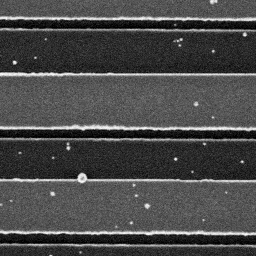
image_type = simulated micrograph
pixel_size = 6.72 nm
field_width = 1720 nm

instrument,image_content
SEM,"lines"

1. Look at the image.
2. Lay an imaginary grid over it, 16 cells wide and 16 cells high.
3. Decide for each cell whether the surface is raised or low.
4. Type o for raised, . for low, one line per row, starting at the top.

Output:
oooooooooooooooo
................
................
................
................
oooooooooooooooo
oooooooooooooooo
oooooooooooooooo
................
................
................
oooooooooooooooo
oooooooooooooooo
oooooooooooooooo
oooooooooooooooo
................